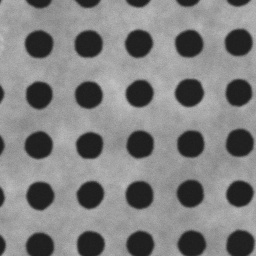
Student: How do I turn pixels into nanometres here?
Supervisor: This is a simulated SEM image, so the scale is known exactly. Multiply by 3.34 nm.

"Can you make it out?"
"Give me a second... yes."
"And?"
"a regular array of holes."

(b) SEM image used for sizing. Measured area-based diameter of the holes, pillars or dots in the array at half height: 91.8 nanometres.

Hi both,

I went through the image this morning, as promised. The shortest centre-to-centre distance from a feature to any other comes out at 0.165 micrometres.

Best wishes